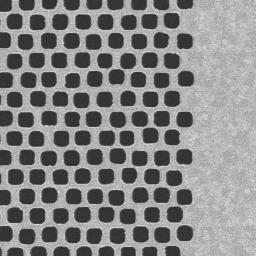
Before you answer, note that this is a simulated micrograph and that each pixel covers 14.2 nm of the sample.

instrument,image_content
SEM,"a regular array of holes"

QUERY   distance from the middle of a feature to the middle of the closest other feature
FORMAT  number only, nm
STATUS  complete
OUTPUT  304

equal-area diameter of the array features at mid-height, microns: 0.239